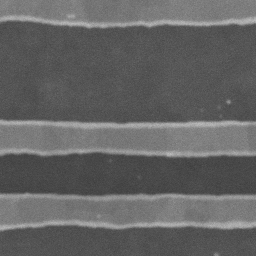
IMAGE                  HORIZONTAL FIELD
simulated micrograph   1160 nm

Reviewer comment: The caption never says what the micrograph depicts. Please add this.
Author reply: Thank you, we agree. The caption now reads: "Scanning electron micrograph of lines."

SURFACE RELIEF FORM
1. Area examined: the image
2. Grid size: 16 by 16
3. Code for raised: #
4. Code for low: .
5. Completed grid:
################
....######.###..
................
................
................
................
................
................
################
################
................
................
################
################
................
................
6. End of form